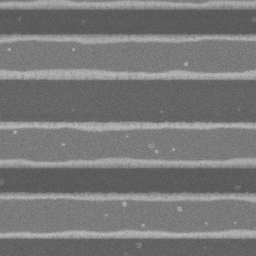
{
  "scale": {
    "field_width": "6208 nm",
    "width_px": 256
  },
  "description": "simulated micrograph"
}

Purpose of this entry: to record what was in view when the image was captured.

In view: lines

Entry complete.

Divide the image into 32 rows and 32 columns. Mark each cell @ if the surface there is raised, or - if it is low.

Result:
@@@@@@@@@@@@@@@@@@@@@@@@@@@@@@@@
--------------------------------
--------------------------------
--------------------------------
-@@@@-----------@-------@@@@@@@-
@@@@@@@@@@@@@@@@@@@@@@@@@@@@@@@@
@@@@@@@@@@@@@@@@@@@@@@@@@@@@@@@@
@@@@@@@@@@@@@@@@@@@@@@@@@@@@@@@@
@@@@@@@@@@@@@@@@@@@@@@@@@@@@@@@@
@@@@@@@@@@@@@@@@@@@@@@@@@@@@@@@@
--------------------------------
--------------------------------
--------------------------------
--------------------------------
--------------------------------
--------------------------------
@@@@@@@@@@@@@@@@@@@@@@@@@@@@@@@@
@@@@@@@@@@@@@@@@@@@@@@@@@@@@@@@@
@@@@@@@@@@@@@@@@@@@@@@@@@@@@@@@@
@@@@@@@@@@@@@@@@@@@@@@@@@@@@@@@@
@@@@@@@@@@@@@@@@@@@@@@@@@@@@@@@@
--------------------------------
--------------------------------
--------------------------------
@@@@@@@@@@@@@@@@@@@@@@@@@@@@@@@@
@@@@@@@@@@@@@@@@@@@@@@@@@@@@@@@@
@@@@@@@@@@@@@@@@@@@@@@@@@@@@@@@@
@@@@@@@@@@@@@@@@@@@@@@@@@@@@@@@@
@@@@@@@@@@@@@@@@@@@@@@@@@@@@@@@@
@@@@@@@@----@@-------@@@@-------
--------------------------------
--------------------------------